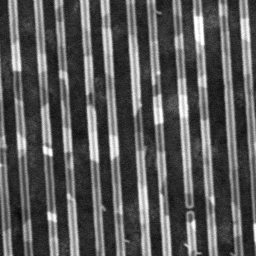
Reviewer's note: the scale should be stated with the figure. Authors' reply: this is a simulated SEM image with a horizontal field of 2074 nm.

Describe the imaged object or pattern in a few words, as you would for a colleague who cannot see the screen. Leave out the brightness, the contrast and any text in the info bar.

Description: parallel lines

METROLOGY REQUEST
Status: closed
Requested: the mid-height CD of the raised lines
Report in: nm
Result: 47.5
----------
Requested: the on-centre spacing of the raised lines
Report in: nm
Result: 187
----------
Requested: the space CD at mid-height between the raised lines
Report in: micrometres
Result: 0.124